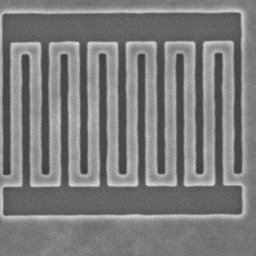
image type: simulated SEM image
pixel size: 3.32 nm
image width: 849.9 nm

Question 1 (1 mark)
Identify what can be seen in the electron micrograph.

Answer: groups of lines, slits or small figures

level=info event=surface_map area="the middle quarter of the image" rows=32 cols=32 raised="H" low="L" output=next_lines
LHHHLLHHHLLHHLLLHHLLHHHLLHHHLLHH
LHHHLLHHHLLHHLLLHHLLHHHLLHHHLLHH
LHHHLLHHHLLHHLLLHHLLHHHLLHHHLLHH
LHHHLLHHHLLHHLLLHHLLHHHLLHHHLLHH
LHHHLLHHHLLHHLLLHHLLHHHLLHHHLLHH
LHHHLLHHHLLHHLLLHHLLHHHLLHHHLLHH
LHHHLLHHHLLHHLLLHHLLHHHLLHHHLLHH
LHHHLLHHHLLHHLLLHHLLHHHLLHHHLLHH
LHHHLLHHHLLHHLLLHHLLHHHLLHHHLLHH
LHHHLLHHHLLHHLLLHHLLHHHLLHHHLLHH
LHHHLLHHHLLHHLLLHHLLHHHLLHHHLLHH
LHHHLLHHHLLHHLLLHHLLHHHLLHHHLLHH
LHHHLLHHHLLHHLLLHHLLHHHLLHHHLLHH
LHHHLLHHHLLHHLLLHHLLHHHLLHHHLLHH
LHHHLLHHHLLHHLLLHHLLHHHLLHHHLLHH
LHHHLLHHHLLHHLLLHHLLHHHLLHHHLLHH
LHHHLLHHHLLHHLLLHHLLHHHLLHHHLLHH
LHHHLLHHHLLHHLLLHHLLHHHLLHHHLLHH
LHHHLLHHHLLHHLLLHHLLHHHLLHHHLLHH
LHHHLLHHHLLHHLLLHHLLHHHLLHHHLLHH
LHHHLLHHHLLHHLLLHHLLHHHLLLHHLLHH
LHHHLLHHHLLHHLLLHHLLHHHLLHHHLLHH
LHHHLLHHHLLHHLLLHHLLHHHLLHHHLLHH
LHHHLLHHHLLHHLLLHHLLHHHLLLHHLLHH
LHHHLLHHHLLHHLLLHHLLHHHLLLHHLLHH
LHHHLLHHHLLHHLLLHHLLHHHLLLHHLLHH
LHHHLLHHHLLHHLLLHHLLHHHLLLHHLLHH
LHHHHHHHHLLHHHLHHHLLHHHHLHHHLLHH
LHHHHHHHHLLHHHHHHHLLHHHHHHHHLLHH
LHHHHHHHHLLHHHHHHHLLHHHHHHHHLLHH
LLHHHHHHHLLLHHHHHHLLLLLLLLHHLLHH
LLLLLLLLLLLLLLLLLLLLLLLLLLLLLLLL